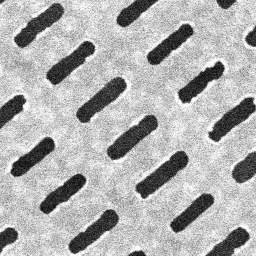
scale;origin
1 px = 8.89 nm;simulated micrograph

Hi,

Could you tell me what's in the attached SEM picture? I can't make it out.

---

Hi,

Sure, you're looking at a regular array of holes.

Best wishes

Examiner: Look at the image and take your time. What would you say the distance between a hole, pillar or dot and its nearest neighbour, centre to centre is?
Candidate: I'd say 428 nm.